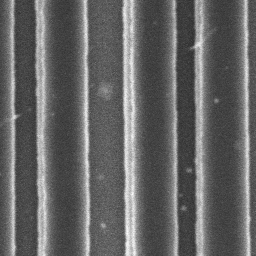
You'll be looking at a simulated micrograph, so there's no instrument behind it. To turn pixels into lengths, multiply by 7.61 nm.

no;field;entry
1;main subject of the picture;lines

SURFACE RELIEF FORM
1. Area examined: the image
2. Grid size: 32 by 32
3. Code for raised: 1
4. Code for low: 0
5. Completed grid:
11001111111000011111110011111110
11001111111000011111110011111110
11000111111000001111110011111110
11000111111000001111110011111110
11000111111000001111110001111110
11000111111000001111110011111110
11000111111000001111110011111110
11000111111000001111110011111110
11000111111000001111110011111110
11000111111000001111110011111110
11000111111000001111110011111110
11000111111000001111110011111110
11000111111000001111110011111110
11000111111000001111110001111110
11000111111000001111110001111110
11000111111000001111110001111110
11000111111000001111110001111110
11000111111000001111110001111110
11000111111000001111110001111110
11000111111000001111110001111110
11000111111000001111110011111110
11000111111000001111110001111110
11000111111000001111110001111110
11000111111000001111110001111110
11000111111000001111110001111110
11000111111000001111110001111110
11000111111000001111110001111110
11000111111000001111110001111110
11000111111000001111110001111110
11000111111000001111110001111110
11000111111000001111110001111110
11000111111000001111110001111110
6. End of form